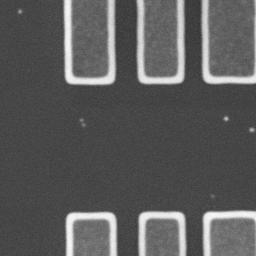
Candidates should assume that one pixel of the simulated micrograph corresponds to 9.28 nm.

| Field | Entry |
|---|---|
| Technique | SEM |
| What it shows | groups of lines, slits or small figures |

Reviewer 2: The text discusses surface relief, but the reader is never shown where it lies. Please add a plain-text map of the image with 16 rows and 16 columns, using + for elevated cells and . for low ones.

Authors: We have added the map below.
....+++..++..+++
....+++..++..+++
....+++..++..+++
....+++..++..+++
....+++..++..+++
................
................
................
................
................
................
................
................
.....++..++..+++
....+++..++..+++
....+++..++..+++